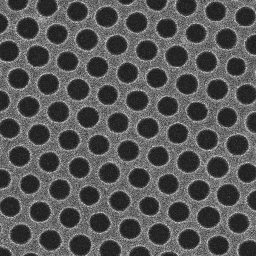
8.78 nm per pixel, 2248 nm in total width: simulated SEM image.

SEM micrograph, a regular array of holes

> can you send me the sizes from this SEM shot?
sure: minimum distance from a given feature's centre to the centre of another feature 29.3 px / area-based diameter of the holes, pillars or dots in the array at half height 0.171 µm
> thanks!